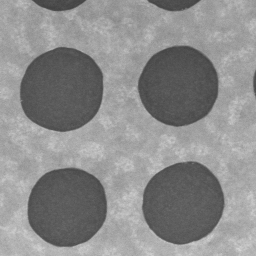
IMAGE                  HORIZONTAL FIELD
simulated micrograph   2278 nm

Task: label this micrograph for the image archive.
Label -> holes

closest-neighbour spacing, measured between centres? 1040 nm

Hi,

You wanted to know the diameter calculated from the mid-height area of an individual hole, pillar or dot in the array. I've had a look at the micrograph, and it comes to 0.722 um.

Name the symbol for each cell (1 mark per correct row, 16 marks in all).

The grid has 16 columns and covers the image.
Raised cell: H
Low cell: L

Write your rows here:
HHHLLHHHHHLLHHHH
HHHHHHHHHHHHHHHH
HHHHHHHHHHHHHHHH
HHLLLLHHHHLLLHHH
HHLLLLHHHLLLLHHH
HLLLLLHHHLLLLLHH
HLLLLLHHHLLLLHHH
HHLLLLHHHHLLHHHH
HHHHHHHHHHHHHHHH
HHHHHHHHHHHHHHHH
HHHHHHHHHHLLLHHH
HHLLLLHHHLLLLLHH
HHLLLLLHHLLLLLHH
HHLLLLLHHLLLLLHH
HHLLLLHHHHLLLHHH
HHHHHHHHHHHHHHHH